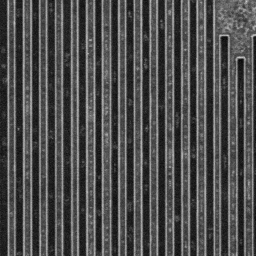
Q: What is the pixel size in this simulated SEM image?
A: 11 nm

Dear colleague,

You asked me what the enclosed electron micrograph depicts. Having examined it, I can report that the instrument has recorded parallel lines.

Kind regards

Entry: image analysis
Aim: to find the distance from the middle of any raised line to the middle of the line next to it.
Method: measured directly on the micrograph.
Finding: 174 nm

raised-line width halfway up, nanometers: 86.7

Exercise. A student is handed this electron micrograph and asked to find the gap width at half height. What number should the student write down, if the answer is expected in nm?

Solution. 97.7